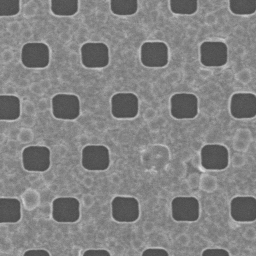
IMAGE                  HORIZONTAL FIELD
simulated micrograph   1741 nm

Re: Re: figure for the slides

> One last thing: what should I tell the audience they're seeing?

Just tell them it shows a regular array of holes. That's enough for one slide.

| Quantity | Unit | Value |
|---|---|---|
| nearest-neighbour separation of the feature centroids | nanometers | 401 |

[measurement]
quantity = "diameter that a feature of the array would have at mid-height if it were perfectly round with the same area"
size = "0.195 microns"